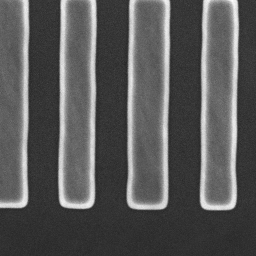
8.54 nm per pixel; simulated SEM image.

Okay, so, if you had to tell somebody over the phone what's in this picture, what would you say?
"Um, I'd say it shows groups of lines, slits or small figures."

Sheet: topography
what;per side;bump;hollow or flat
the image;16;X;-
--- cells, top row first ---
XX--XX--XXX--XX-
XX--XX--XX---XX-
XX--XX--XX---XX-
XX--XX--XX---XX-
XX--XX--XX---XX-
XX--XX--XX---XX-
XX--XX--XX---XX-
XX--XX--XX---XX-
XX--XX--XX---XX-
XX--XX--XX---XX-
XX--XX--XX---XX-
XX--XX--XX---XX-
X---XX--XX---XX-
----------------
----------------
----------------